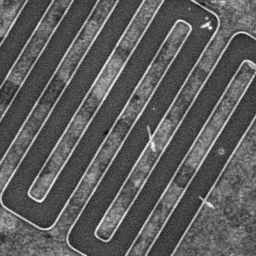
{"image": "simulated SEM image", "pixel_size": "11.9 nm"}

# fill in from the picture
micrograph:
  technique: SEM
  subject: groups of lines, slits or small figures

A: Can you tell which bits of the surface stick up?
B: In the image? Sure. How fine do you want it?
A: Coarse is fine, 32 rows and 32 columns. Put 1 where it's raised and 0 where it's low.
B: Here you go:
11100011100011000011000001111111
11100011000111000111000000111111
11000111000110001110000000011111
10000110001110001100001100011111
10001100001100011100011000011001
00011100011000011000111000111000
00011000111000111000110001110000
00111000110001110001110001100000
00110001110001100001100011100011
01100001100011100011000011000111
11100011000011000111000111000110
11000111000111000110001110001110
11000110001110001110001100001100
10001110001100001100011100011000
00001100011100011000011000111000
00011000011000111000110000110001
00111000111000110001110001110001
00110001110001110001100011100011
01110001100001100011100011000011
01100011100011000011000111000111
11000011000111000110000110001111
11000110000110001110001110001111
10001110001110001100011100011111
10001100001100011100011000011111
00001100011000011000111000111111
00000000111000110000110001111111
11000000110001110001100001111111
11100001110001100011100011111111
11111011100011100011000111111111
11111111000011000111000111111111
11111111100000000110001111111111
11111111110000001110001111111111